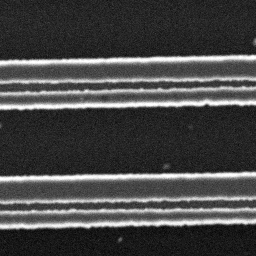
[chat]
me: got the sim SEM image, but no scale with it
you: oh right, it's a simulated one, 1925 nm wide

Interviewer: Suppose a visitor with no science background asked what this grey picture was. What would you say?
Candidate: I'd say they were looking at lines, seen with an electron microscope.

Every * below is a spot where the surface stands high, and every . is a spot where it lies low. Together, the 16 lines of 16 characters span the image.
................
................
................
................
****************
****************
************....
................
................
................
................
****************
****************
****************
................
................